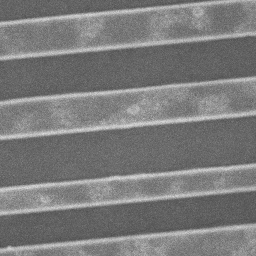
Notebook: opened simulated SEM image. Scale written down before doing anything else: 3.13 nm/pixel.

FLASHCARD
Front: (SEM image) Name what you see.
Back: one or a few lines or trenches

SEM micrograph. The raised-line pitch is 251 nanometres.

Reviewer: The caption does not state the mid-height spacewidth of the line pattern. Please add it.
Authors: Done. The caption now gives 134 nanometers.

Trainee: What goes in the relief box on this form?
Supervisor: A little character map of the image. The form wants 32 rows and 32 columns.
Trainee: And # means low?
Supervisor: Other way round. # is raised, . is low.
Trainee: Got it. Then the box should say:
........................########
..............##################
....############################
################################
#############################...
###################.............
#########.......................
................................
................................
................................
........................########
.............###################
...#############################
################################
#############################...
###################.............
########........................
................................
................................
................................
................................
.......................#########
.............###################
.###############################
#######################.........
#############...................
###.............................
................................
............................####
..................##############
.......#########################
################################